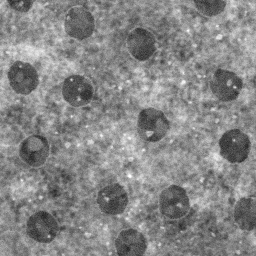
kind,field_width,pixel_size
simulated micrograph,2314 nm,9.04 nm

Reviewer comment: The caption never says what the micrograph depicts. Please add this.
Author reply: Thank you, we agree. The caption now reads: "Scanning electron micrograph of a regular array of raised bodies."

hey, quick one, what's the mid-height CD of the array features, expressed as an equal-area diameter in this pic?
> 304 nm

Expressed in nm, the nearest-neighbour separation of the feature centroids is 554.